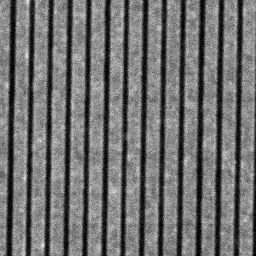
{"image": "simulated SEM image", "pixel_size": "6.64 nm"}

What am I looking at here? parallel lines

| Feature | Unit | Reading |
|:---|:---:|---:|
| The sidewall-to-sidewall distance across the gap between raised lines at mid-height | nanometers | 47.3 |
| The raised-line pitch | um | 0.126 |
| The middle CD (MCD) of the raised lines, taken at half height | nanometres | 82.2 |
